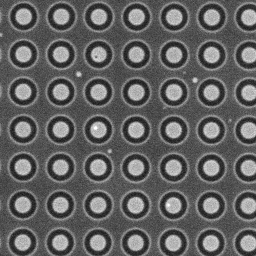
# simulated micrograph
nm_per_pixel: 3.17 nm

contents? an array of small figures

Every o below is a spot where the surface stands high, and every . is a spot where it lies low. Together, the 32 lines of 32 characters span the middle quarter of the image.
.oooooo....ooooo....ooooo.....oo
oooooooooooooooooooooooooooooooo
oooooooooooooooooooooooooooooooo
oooooooooooooooooooooooooooooooo
..oooo.....ooooo....ooooo.....oo
..ooo.......ooo......ooo.......o
...oo.......ooo.......oo.......o
...oo.......ooo.......oo.......o
..ooo.......ooo......ooo.......o
..oooo.....oooo......oooo.....oo
oooooooo.oooooooo..ooooooo...ooo
oooooooooooooooooooooooooooooooo
oooooooooooooooooooooooooooooooo
.oooooo....ooooo....ooooo....ooo
..oooo......ooo......oooo.....oo
...oo.......ooo......ooo.......o
...oo.......oo........oo.......o
...oo.......ooo......ooo.......o
..oooo......ooo......oooo.....oo
.oooooo....ooooo....oooooo...ooo
oooooooooooooooooooooooooooooooo
oooooooooooooooooooooooooooooooo
ooooooo...ooooooo..oooooooo.oooo
..oooo.....oooo......oooo.....oo
..ooo.......ooo......ooo.......o
...oo.......oo........oo.......o
...oo.......oo.......ooo.......o
..ooo.......ooo......ooo.......o
.ooooo.....ooooo....ooooo.....oo
ooooooooooooooooooooooooooo.oooo
oooooooooooooooooooooooooooooooo
oooooooooooooooooooooooooooooooo